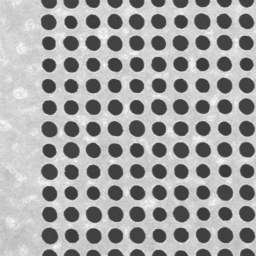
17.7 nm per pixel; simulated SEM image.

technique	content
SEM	a regular array of holes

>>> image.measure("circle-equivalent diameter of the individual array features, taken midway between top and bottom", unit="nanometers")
271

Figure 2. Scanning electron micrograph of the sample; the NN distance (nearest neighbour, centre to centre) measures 375 nm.